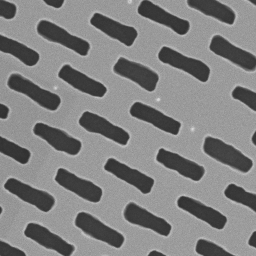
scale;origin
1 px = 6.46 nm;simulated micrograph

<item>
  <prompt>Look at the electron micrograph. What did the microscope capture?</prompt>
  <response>a regular array of holes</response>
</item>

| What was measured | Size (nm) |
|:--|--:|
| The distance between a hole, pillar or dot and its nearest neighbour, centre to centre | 312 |